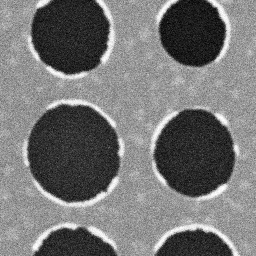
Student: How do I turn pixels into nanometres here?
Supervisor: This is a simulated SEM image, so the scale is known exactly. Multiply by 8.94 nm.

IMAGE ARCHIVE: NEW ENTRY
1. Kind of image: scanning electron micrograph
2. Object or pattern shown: holes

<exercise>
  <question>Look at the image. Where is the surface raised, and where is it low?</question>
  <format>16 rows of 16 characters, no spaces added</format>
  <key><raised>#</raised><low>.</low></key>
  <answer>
###...#####..###
##.....###....##
##.....###....##
##....#####...##
####.###########
################
################
##.....####...##
##.....###....##
##.....###.....#
##.....###.....#
##.....####...##
####..##########
################
###...#####..###
##.....###....##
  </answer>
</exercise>